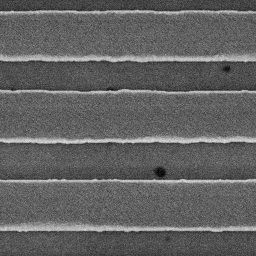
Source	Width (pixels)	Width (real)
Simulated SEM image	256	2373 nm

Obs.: lines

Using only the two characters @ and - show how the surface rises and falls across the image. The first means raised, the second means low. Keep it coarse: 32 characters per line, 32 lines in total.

--------------------------------
@@@@@@@@@@@@@@@@@@@@@@@@@@@@@@@@
@@@@@@@@@@@@@@@@@@@@@@@@@@@@@@@@
@@@@@@@@@@@@@@@@@@@@@@@@@@@@@@@@
@@@@@@@@@@@@@@@@@@@@@@@@@@@@@@@@
@@@@@@@@@@@@@@@@@@@@@@@@@@@@@@@@
@@@@@@@@@@@@@@@@@@@@@@@@@@@@@@@@
-------------@@-----------------
--------------------------------
--------------------------------
--------------------------------
@@@@@@@@@@-@@@@@@@@@@--@@@@@@@@@
@@@@@@@@@@@@@@@@@@@@@@@@@@@@@@@@
@@@@@@@@@@@@@@@@@@@@@@@@@@@@@@@@
@@@@@@@@@@@@@@@@@@@@@@@@@@@@@@@@
@@@@@@@@@@@@@@@@@@@@@@@@@@@@@@@@
@@@@@@@@@@@@@@@@@@@@@@@@@@@@@@@@
@@@@@@@@@@@@@@@@@@@@@@@@@@@@@@@@
--------------------------------
--------------------------------
--------------------------------
--------------------------------
-----------@-@@----------------@
@@@@@@@@@@@@@@@@@@@@@@@@@@@@@@@@
@@@@@@@@@@@@@@@@@@@@@@@@@@@@@@@@
@@@@@@@@@@@@@@@@@@@@@@@@@@@@@@@@
@@@@@@@@@@@@@@@@@@@@@@@@@@@@@@@@
@@@@@@@@@@@@@@@@@@@@@@@@@@@@@@@@
@@@@@@@@@@@@@@@@@@@@@@@@@@@@@@@@
--------------------------------
--------------------------------
--------------------------------